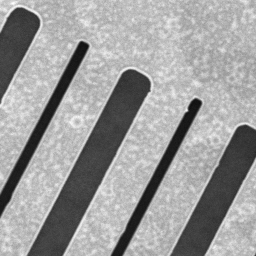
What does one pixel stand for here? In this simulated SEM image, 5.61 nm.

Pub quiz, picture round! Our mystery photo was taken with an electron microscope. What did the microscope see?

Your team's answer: one or a few lines or trenches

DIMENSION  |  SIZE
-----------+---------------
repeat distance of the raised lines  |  0.341 micrometres